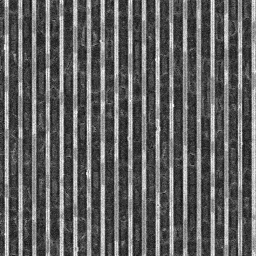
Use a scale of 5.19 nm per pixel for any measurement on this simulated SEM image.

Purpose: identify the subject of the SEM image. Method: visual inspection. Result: parallel lines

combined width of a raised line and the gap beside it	71.1	nm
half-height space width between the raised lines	54.5	nm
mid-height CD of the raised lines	19.5	nanometres